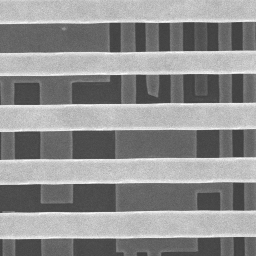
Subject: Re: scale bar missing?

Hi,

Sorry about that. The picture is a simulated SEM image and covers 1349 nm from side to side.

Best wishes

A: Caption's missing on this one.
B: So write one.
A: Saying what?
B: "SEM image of wiring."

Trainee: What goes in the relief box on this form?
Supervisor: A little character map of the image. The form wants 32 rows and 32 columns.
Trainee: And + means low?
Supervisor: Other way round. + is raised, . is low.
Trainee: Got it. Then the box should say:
++++++++++++++++++++++++++++++++
++++++++++++++++++++++++++++++++
++++++++++++++++++++++++++++++++
................................
................................
................................
..................++++++++++++++
++++++++++++++++++++++++++++++++
++++++++++++++++++++++++++++++++
................................
................................
................................
................................
++++++++++++++++++++++++++++++++
++++++++++++++++++++++++++++++++
++++++++++++++++++++++++++++++++
................................
................................
................................
................................
++++++++++++++++++++++++++++++++
++++++++++++++++++++++++++++++++
++++++++++++++++++++++++++++++++
................................
................................
................................
...............+++++++++++++++++
++++++++++++++++++++++++++++++++
++++++++++++++++++++++++++++++++
++++++++++++++++++++++++++++++++
................................
................................